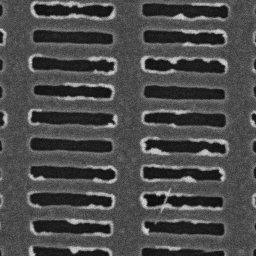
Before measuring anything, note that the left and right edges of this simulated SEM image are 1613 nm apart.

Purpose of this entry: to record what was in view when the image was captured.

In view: a regular array of holes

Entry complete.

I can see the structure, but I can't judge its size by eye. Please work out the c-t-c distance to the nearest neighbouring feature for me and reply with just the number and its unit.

170 nm